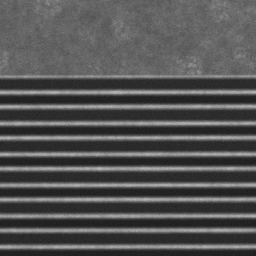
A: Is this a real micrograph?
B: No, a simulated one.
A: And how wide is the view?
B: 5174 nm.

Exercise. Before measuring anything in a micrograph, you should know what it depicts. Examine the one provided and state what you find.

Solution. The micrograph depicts parallel lines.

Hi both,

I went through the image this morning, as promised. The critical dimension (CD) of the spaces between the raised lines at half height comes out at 245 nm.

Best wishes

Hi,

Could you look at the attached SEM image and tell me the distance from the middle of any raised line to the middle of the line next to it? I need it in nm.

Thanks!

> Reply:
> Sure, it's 312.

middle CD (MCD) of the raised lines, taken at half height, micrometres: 0.0758